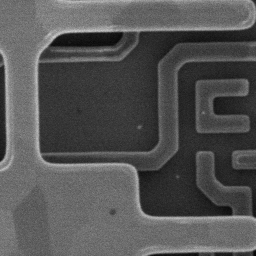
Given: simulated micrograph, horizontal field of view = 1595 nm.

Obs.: wiring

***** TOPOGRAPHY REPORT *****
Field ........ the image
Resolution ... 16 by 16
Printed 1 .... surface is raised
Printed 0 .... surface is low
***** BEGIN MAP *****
1111111111111111
1111111111111111
1110000000000000
1110000000000000
1100000000000000
1100000000000000
1100000000000000
1100000000000000
1100000000000000
1110000000000000
1111111100000000
1111111110000000
1111111110000000
1111111111000000
1111111111111111
1111111111111111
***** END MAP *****